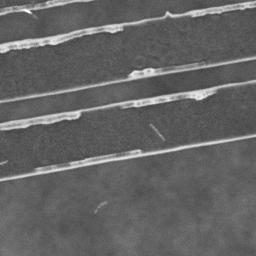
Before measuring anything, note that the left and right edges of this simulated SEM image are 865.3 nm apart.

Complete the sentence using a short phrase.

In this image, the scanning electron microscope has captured one or a few lines or trenches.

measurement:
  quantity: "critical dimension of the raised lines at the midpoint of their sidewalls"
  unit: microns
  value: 0.188